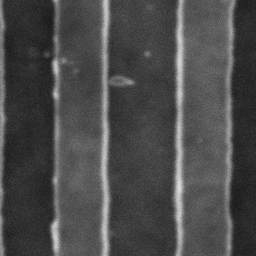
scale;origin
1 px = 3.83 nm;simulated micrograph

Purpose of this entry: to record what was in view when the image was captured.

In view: lines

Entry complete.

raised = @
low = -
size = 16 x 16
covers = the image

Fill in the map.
---@@@@----@@@@-
---@@@@----@@@--
---@@@@----@@@@-
---@@@@----@@@--
---@@@@----@@@--
---@@@@----@@@--
---@@@@----@@@--
---@@@@----@@@--
---@@@@----@@@--
---@@@@----@@@--
---@@@@----@@@--
---@@@@----@@@--
---@@@@----@@@--
---@@@@----@@@--
---@@@@----@@@--
---@@@@----@@@--